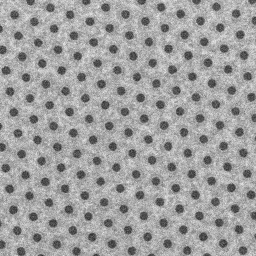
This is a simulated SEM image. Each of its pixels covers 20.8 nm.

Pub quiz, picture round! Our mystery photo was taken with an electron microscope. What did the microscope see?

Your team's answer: a regular array of holes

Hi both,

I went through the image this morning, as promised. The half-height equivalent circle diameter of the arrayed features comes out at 193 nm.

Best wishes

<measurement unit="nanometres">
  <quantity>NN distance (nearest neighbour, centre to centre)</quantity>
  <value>433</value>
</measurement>